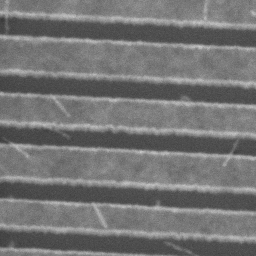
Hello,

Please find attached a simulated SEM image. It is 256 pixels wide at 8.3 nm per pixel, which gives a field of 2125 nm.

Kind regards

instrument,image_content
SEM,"lines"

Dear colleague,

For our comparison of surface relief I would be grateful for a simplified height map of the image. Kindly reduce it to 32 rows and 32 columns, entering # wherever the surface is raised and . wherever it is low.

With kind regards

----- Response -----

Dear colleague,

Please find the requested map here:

################################
################################
.............#.#################
................................
#...............................
#####################...........
################################
################################
################################
.........#######################
.............................###
................................
###################.............
################################
################################
.###############################
...................##.##########
................................
#############...................
##############################..
################################
################################
.###############################
.....................###########
................................
#############...................
################################
################################
.###############################
......................##########
................................
############....................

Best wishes